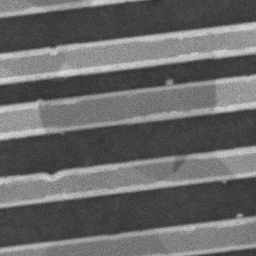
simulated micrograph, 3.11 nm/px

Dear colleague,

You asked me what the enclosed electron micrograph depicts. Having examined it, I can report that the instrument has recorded one or a few lines or trenches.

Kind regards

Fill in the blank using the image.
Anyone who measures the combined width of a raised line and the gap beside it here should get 62.3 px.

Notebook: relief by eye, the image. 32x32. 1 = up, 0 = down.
11111111111100000000000000000000
11100000000000000000000000000000
00000000000000000000000000000000
00000000000000000000000000000111
00000000000000000000111111111111
00000000000011111111111111111111
00001111111111111111111111111100
11111111111111111111110000000000
11111111111111100000000000000000
11111110000000000000000000000000
00000000000000000000000000111111
00000000000000000111111111111111
00000000011111111111111111111111
11111111111111111111111111111100
11111111111111111111100000000000
11111111111110000000000000000000
11111000000000000000000000000000
00000000000000000000000000000000
00000000000000000000000000000000
00000000000000000000000001111111
00000000000000000111111111111111
00000000011111111111111111111111
01111111111111111111111110000000
11111111111111111100000000000000
11111111110000000000000000000000
11000000000000000000000000000000
00000000000000000000000000000000
00000000000000000000000000000001
00000000000000000000000111111111
00000000000000011111111111111111
00000001111111111111111111111111
11111111111111111111111110000000